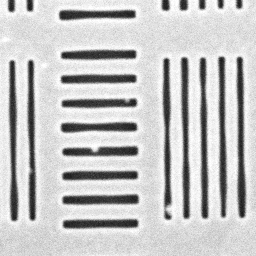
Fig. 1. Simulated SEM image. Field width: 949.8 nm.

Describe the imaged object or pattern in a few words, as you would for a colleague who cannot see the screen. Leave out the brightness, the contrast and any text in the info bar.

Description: groups of lines, slits or small figures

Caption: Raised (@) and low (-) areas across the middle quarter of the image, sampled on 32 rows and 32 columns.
@@@@@@@@@@@@@@@@@@@@@@@@@--@@--@
@@@@@@@@@@@@@@@@@@@@@@@@@--@@--@
@@@@@----@@@@@@@--@@@@@@@--@@--@
------------------@@@@@@@--@@--@
------------------@@@@@@@--@@--@
@@@@@@@@@@@@@@@@@@@@@@@@@--@@--@
@@@@@@@@@@@@@@@@@@@@@@@@---@@--@
@@@@@@@@@@@@@@@@@@@@@@@@---@@--@
@@@@--------------@@@@@@---@@--@
-------------------@@@@@---@@--@
------------------@@@@@@---@@--@
@@@@@@@@@@@@@@@@@@@@@@@@@--@@--@
@@@@@@@@@@@@@@@@@@@@@@@@@--@@--@
@@@@@@@@@@@@@@@@@@@@@@@@@--@@--@
@-@@@@@@@@@@------@@@@@@@--@@--@
-------------------@@@@@@--@@--@
------------------@@@@@@@--@@--@
@@@@@@@@@@@@@@@@@@@@@@@@@--@@@-@
@@@@@@@@@@@@@@@@@@@@@@@@@--@@@-@
@@@@@@@@@@@@@@@@@@@@@@@@@--@@@-@
@@@@@@@@@@@@@@@@--@@@@@@@--@@@-@
-------------------@@@@@@--@@@-@
-------------------@@@@@@--@@@-@
@@@@@@@@@@@@@@@@@@@@@@@@@--@@@-@
@@@@@@@@@@@@@@@@@@@@@@@@@--@@@-@
@@@@@@@@@@@@@@@@@@@@@@@@@--@@@--
@@@@-----@@@@@@---@@@@@@@--@@---
-------------------@@@@@@--@@---
-------------------@@@@@@--@@---
@@@@@@@@@@@@@@@@@@@@@@@@@--@@---
@@@@@@@@@@@@@@@@@@@@@@@@@--@@---
@@@@@@@@@@@@@@@@@@@@@@@@@--@@@--